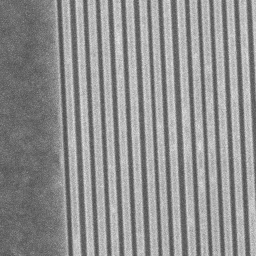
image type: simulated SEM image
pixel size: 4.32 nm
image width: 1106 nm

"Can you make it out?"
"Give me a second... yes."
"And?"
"parallel lines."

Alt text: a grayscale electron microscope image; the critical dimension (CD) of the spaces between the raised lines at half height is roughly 21.6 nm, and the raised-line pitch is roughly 54.6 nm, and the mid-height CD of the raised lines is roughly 30.2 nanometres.